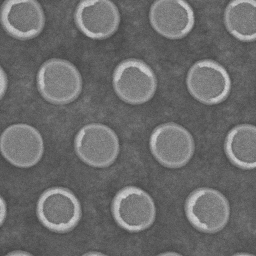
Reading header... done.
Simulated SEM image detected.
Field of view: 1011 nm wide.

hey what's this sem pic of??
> a regular array of raised bodies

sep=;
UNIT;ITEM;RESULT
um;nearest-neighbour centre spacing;0.291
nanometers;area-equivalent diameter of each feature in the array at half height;169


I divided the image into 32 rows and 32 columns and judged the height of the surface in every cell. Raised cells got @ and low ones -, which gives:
-@@@@-----@@@@-----@@@@------@@@
@@@@@-----@@@@@----@@@@@----@@@@
@@@@@----@@@@@@----@@@@@----@@@@
-@@@@-----@@@@-----@@@@@----@@@@
--@@-------@@--------@@------@@@
--------------------------------
--------------------------------
--------------------------------
-----@@@@------@@@@-----@@@@----
@----@@@@@----@@@@@----@@@@@@---
@----@@@@@----@@@@@----@@@@@@---
-----@@@@@-----@@@@-----@@@@@---
------@@@-------@@-------@@@----
--------------------------------
--------------------------------
--------------------------------
@@@@@-----@@@@-----@@@@------@@@
@@@@@----@@@@@@----@@@@@----@@@@
@@@@@----@@@@@@----@@@@@----@@@@
-@@@@-----@@@@@----@@@@@-----@@@
--@@-------@@@-------@@------@@@
--------------------------------
--------------------------------
----------------@---------------
-----@@@@-----@@@@@-----@@@@----
@----@@@@@----@@@@@----@@@@@----
@----@@@@@----@@@@@----@@@@@@---
-----@@@@@-----@@@@-----@@@@----
------@@@-------@@-------@@@----
--------------------------------
--------------------------------
--------------------------------